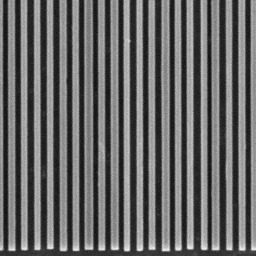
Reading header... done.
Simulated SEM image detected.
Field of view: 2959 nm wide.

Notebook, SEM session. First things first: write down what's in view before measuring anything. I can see parallel lines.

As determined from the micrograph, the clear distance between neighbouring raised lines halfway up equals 73.7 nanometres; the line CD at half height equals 0.0636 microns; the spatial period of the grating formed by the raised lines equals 12.8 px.